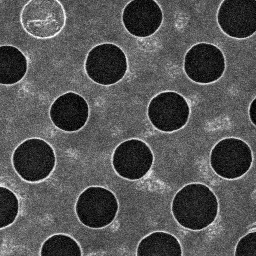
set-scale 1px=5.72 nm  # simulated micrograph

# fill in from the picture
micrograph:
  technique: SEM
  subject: a regular array of holes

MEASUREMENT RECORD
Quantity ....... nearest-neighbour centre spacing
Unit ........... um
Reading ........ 0.343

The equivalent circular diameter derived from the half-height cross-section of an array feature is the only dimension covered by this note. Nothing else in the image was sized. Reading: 237 nm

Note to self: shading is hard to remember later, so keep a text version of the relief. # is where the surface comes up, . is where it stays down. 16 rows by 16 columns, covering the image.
########..####..
########..####..
################
.####...####..##
..###...####..##
################
###..####...####
###..####...####
################
#..####..####...
#..####..####...
################
.####..####...##
.####..####..###
################
###..####..####.